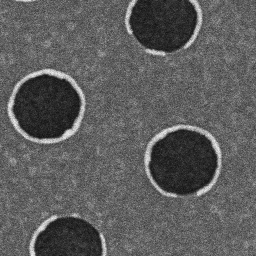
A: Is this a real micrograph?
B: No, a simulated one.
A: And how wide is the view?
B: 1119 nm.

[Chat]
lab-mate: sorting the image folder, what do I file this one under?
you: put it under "holes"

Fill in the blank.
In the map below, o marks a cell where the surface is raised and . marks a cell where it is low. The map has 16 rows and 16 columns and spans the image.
oooooooo....oooo
oooooooo....oooo
ooooooooo...oooo
oooooooooooooooo
oooooooooooooooo
o....ooooooooooo
o....ooooooooooo
o....ooooooooooo
oo..oooooo...ooo
ooooooooo....ooo
ooooooooo.....oo
oooooooooo...ooo
oooooooooooooooo
oooooooooooooooo
ooo...oooooooooo
oo....oooooooooo